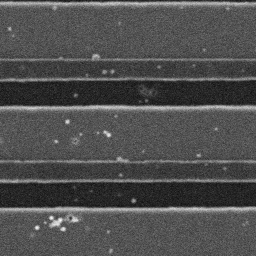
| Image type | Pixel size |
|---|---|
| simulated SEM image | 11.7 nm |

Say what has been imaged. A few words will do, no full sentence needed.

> lines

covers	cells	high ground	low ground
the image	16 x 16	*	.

****************
****************
****************
****************
****************
................
................
****************
****************
****************
****************
................
................
****************
****************
****************